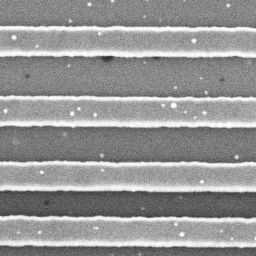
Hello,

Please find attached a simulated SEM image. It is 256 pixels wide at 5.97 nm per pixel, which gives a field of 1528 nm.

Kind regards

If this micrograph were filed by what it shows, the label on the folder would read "lines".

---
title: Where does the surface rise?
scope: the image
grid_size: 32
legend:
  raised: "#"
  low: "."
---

................................
................................
................................
########################.######.
################################
################################
################################
................................
................................
................................
................................
................................
################################
################################
################################
################################
................................
................................
................................
................................
################################
################################
################################
################################
................................
................................
................................
################################
################################
################################
################################
................................